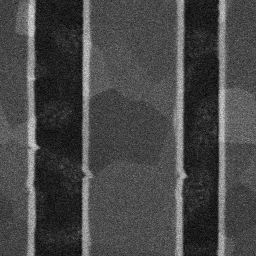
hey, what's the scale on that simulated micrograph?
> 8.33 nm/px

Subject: one or a few lines or trenches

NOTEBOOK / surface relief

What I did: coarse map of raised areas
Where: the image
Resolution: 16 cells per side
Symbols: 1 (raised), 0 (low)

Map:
1100011111100011
1100011111100011
1100011111100011
1100011111100011
1100011111100011
1100011111100011
1100011111100011
1100011111100011
1100011111100011
1100011111100011
1100011111100011
1100011111100011
1100011111100011
1100011111100011
1100011111100011
1100011111100011